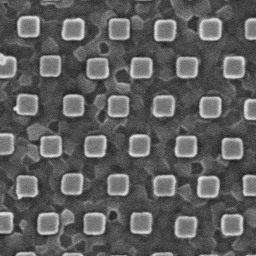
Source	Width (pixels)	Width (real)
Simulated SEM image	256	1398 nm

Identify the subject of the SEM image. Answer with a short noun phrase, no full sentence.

a regular array of raised bodies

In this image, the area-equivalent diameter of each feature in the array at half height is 122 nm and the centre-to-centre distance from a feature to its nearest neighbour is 241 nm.